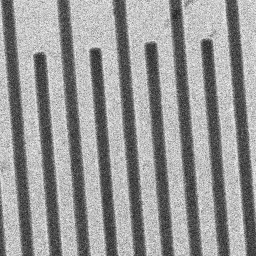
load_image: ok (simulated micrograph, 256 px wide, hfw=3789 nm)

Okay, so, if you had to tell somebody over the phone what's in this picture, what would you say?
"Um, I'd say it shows parallel lines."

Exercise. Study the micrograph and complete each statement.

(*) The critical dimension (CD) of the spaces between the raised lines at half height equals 0.173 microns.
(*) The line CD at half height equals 16.7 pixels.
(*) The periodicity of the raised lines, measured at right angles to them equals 414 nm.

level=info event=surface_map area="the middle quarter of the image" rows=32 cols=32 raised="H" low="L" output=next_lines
LLLHHHHLLLHHHHLLLHHHHLLLHHHHLLLH
LLLHHHHLLLHHHHLLLHHHHLLLHHHHLLLH
LLLHHHHLLLHHHHLLLHHHHLLLHHHHLLLH
LLLHHHHLLLHHHHLLLHHHHLLLHHHHLLLH
LLLHHHHLLLHHHHLLLHHHHLLLHHHHLLLH
LLLHHHHLLLHHHHLLLHHHHLLLHHHHLLLH
LLLHHHHLLLHHHHLLLHHHHLLLHHHHLLLH
LLLHHHHLLLHHHHLLLHHHHLLLHHHHLLLH
LLLHHHHLLLHHHHLLLHHHHLLLHHHHLLLH
LLLHHHHLLLHHHHLLLHHHHLLLHHHHLLLH
LLLLHHHHLLHHHHLLLLHHHLLLLHHHLLLH
LLLLHHHHLLLHHHHLLLHHHLLLLHHHLLLL
HLLLHHHHLLLHHHHLLLHHHHLLLHHHLLLL
HLLLHHHHLLLHHHHLLLHHHHLLLHHHHLLL
HLLLHHHHLLLHHHHLLLHHHHLLLHHHHLLL
HLLLHHHHLLLHHHHLLLHHHHLLLHHHHLLL
HLLLHHHHLLLHHHHLLLHHHHLLLHHHHLLL
HLLLHHHHLLLHHHHLLLHHHHLLLHHHHLLL
HLLLHHHHLLLHHHHLLLHHHHLLLHHHHLLL
HLLLHHHHLLLHHHHLLLHHHHLLLHHHHLLL
HLLLHHHHLLLHHHHLLLHHHHLLLHHHHLLL
HLLLHHHHLLLHHHHLLLHHHHLLLHHHHLLL
HLLLLHHHHLLHHHHLLLHHHHLLLLHHHLLL
HLLLLHHHHLLLHHHHLLHHHHLLLLHHHLLL
HHLLLHHHHLLLHHHHLLLHHHHLLLHHHLLL
HHLLLHHHHLLLHHHHLLLHHHHLLLHHHHLL
HHLLLHHHHLLLHHHHLLLHHHHLLLHHHHLL
HHLLLHHHHLLLHHHHLLLHHHHLLLHHHHLL
HHLLLHHHHLLLHHHHLLLHHHHLLLHHHHLL
HHLLLHHHHLLLHHHHLLLHHHHLLLHHHHLL
HHLLLHHHHLLLHHHHLLLHHHHLLLHHHHLL
HHLLLHHHHLLLHHHHLLLHHHHLLLHHHHLL